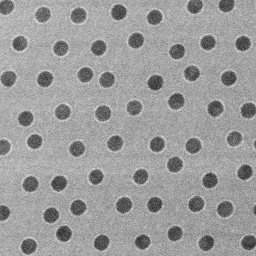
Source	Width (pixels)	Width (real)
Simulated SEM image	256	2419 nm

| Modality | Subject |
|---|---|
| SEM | a regular array of raised bodies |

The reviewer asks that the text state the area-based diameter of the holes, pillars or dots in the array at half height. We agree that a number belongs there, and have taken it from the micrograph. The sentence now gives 166 nm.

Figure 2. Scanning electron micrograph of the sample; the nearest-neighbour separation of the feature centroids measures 292 nanometres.